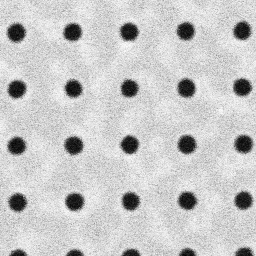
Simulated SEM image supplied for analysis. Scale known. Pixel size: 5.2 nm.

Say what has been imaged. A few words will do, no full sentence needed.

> a regular array of holes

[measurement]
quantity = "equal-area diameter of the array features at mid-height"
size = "103 nanometres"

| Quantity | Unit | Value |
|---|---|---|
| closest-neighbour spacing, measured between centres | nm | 293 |